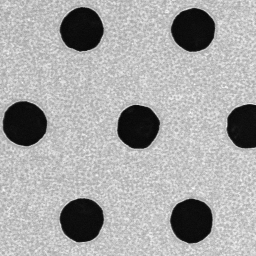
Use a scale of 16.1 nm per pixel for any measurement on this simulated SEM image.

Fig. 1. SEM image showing holes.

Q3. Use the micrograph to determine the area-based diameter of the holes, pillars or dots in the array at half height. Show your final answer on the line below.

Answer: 43.6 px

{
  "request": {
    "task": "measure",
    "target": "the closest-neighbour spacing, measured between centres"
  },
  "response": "1760 nanometers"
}